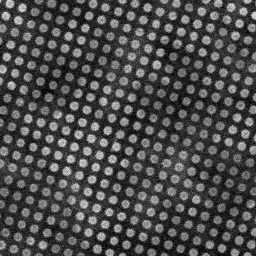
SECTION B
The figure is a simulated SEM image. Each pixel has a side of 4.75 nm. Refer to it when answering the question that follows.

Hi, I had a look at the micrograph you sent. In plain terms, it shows a regular array of raised bodies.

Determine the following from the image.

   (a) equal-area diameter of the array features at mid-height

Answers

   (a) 37.5 nanometers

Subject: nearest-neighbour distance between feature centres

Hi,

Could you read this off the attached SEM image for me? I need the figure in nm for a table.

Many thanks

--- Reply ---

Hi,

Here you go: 60.6